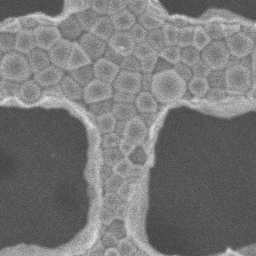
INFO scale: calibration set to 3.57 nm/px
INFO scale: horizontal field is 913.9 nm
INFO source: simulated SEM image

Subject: holes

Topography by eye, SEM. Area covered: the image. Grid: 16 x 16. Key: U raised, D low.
DDDDUUUUUUDDDDDD
UUUUUUUUUUUUUUUU
UUUUUUUUUUUUUUUU
UUUUUUUUUUUUUUUU
UUUUUUUUUUUUUUUU
UUUUUUUUUUUUUUUU
UUUUUUUUUUUUUUUU
DDDDDUUUUUDDDDDD
DDDDDDUUUUDDDDDD
DDDDDDUUUUDDDDDD
DDDDDDUUUDDDDDDD
DDDDDDUUUDDDDDDD
DDDDDDUUUDDDDDDD
DDDDDDUUUDDDDDDD
DDDDDUUUUDDDDDDD
DDDDUUUUUDDDDDDD